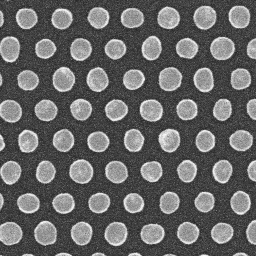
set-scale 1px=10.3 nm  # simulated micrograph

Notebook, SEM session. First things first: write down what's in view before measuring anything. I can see a regular array of raised bodies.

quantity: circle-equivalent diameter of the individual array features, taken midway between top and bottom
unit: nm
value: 214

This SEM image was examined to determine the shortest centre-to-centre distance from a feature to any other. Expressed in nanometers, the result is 359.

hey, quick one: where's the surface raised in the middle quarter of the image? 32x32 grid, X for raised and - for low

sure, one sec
--------------------------------
X------XXX---------------XXX----
XX----XXXX-----XXXXX----XXXXX---
XXX---XXXXX----XXXXX----XXXXX---
XXX---XXXXX----XXXXX----XXXXX---
XX----XXXXX----XXXX-----XXXXX---
X------XX----------------XXX----
--------------------------------
--------------------------------
--XXXX------XXX-----XXX-------XX
--XXXXX----XXXXX---XXXXX-----XXX
--XXXXX---XXXXXX---XXXXX----XXXX
--XXXXX----XXXX----XXXXX----XXXX
---XXX-----XXX------XXXX-----XXX
--------------------------------
--------------------------------
X----------------X-------XX-----
XX-----XXX------XXX-----XXXXX---
XX----XXXXX----XXXXX----XXXXX---
XX----XXXXX----XXXXX----XXXXX---
XX----XXXXX----XXXX-----XXXX----
X------XXX-------X-------XX-----
--------------------------------
--------------------------------
---XXX------XX--------X-------XX
--XXXXX----XXXX-----XXXX-----XXX
--XXXXX----XXXXX---XXXXX----XXXX
--XXXXX----XXXXX---XXXXX-----XXX
--XXXXX----XXXX-----XXXX-----XXX
---XXX------XX----------------X-
--------------------------------
--------------------------------